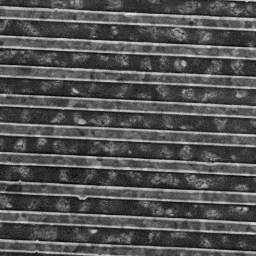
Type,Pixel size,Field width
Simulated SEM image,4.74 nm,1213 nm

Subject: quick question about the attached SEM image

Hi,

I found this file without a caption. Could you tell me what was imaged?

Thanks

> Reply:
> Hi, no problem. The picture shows parallel lines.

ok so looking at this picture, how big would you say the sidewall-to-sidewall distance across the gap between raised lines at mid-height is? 18.7 px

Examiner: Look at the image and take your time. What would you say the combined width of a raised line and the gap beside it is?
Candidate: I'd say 0.138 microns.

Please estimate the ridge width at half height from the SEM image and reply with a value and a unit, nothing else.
49.1 nm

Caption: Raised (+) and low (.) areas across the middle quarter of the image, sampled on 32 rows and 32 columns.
................................
++++++..........................
+++++++++++++++++++++++++++.....
++++++++++++++++++++++++++++++++
..............++...+++++++++++++
................................
................................
................................
................................
+++++++++++++++++++++...........
++++++++++++++++++++++++++++++++
........+++..+++++++++++++++++++
................................
................................
................................
................................
++++++++++++++++++++............
++++++++++++++++++++++++++++++++
........++++++++++++++++++++++++
............................++++
................................
................................
................................
++++++++++......................
++++++++++++++++++++++++++++++..
..++++++++++++++++++++++++++++++
.......................+++++++++
................................
................................
................................
++++............................
+++++++++++++++++++++++++.......